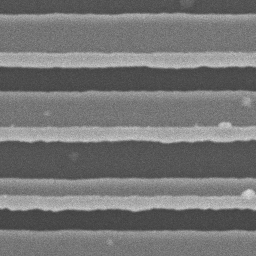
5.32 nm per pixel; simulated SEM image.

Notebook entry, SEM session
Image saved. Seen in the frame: lines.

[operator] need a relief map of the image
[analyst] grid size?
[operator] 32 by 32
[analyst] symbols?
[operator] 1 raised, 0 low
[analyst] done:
00000000000000000000000000000000
00000000000000000000000000000000
11111111111111111111111111111111
11111111111111111111111111111111
11111111111111111111111111111111
11111111111111111111111111111111
11111111111111111111111111111111
11111111111111111111111111111111
00000000000000000000111110000000
00000000000000000000000000000000
00000000000000000000000000000000
00000000000111101101111111111110
11111111111111111111111111111111
11111111111111111111111111111111
11111111111111111111111111111111
11111111111111111111111111111111
11111111111111111111111111111111
11111111111111111111111111111111
00000000000000000000000000000000
00000000000000000000000000000000
00000000000000000000000000000000
00000000000000000000000000000000
11111110000111111111111111111111
11111111111111111111111111111111
11111111111111111111111111111111
11111111111111111111111111111111
00000000000000000000000000000000
00000000000000000000000000000000
00000000000000000000000000000000
11111111111111111111111111111111
11111111111111111111111111111111
11111111111111111111111111111111